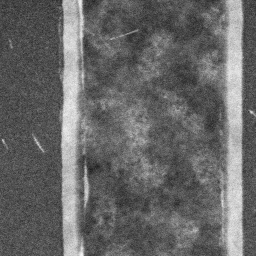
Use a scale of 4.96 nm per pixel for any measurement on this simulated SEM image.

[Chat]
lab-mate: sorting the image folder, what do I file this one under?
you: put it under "one or a few lines or trenches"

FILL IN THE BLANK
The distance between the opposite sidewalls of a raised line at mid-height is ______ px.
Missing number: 165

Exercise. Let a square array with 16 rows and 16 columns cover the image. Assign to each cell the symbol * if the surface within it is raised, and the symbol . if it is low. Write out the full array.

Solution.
....***********.
....***********.
....***********.
....***********.
....***********.
....***********.
....***********.
....***********.
....***********.
....***********.
....***********.
....***********.
....***********.
....***********.
....***********.
....***********.